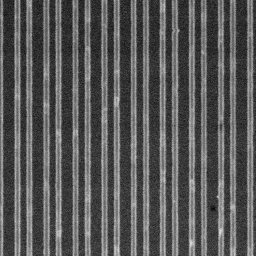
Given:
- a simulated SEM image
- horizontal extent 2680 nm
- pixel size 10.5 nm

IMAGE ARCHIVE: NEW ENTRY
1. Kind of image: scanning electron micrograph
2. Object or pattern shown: parallel lines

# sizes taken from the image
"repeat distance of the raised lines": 152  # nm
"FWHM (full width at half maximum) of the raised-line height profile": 0.051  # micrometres